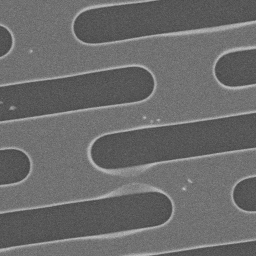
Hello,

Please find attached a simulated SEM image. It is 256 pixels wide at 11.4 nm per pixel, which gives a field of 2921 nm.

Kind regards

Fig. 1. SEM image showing groups of lines, slits or small figures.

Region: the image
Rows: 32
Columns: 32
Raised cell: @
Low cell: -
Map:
@@@@@@@@@@@@@@@@----------------
@@@@@@@@@@----------------------
@@@@@@@@@-----------------------
-@@@@@@@@-------------------@@@@
-@@@@@@@@@--------@@@@@@@@@@@@@@
--@@@@@@@@@@@@@@@@@@@@@@@@@@@@@@
-@@@@@@@@@@@@@@@@@@@@@@@@@@@@---
@@@@@@@@@@@@@@@@@@@@@@@@@@@-----
@@@@@@@@@@@@@@@---@@@@@@@@@-----
@@@@@@@@@----------@@@@@@@@-----
@@-----------------@@@@@@@@@----
-------------------@@@@@@@@@@@@@
------------------@@@@@@@@@@@@@@
------------@@@@@@@@@@@@@@@@@@@@
-----@@@@@@@@@@@@@@@@@@@@@@@@---
@@@@@@@@@@@@@@@@@@@@@@----------
@@@@@@@@@@@@@@@@----------------
@@@@@@@@@@@@--------------------
@@@@@@@@@@@---------------------
---@@@@@@@@--------------@@@@@@@
----@@@@@@@@-------@@@@@@@@@@@@@
----@@@@@@@@@@@@@@@@@@@@@@@@@@@@
---@@@@@@@@@@@@@@@@@@@@@@@@@@@--
@@@@@@@@@@@@@@@@@@@@@@@@@@@@@---
@@@@@@@@@@@@@--------@@@@@@@@---
@@@@@@@@--------------@@@@@@@---
@@--------------------@@@@@@@@@-
---------------------@@@@@@@@@@@
------------------@@@@@@@@@@@@@@
-------------@@@@@@@@@@@@@@@@@@@
----@@@@@@@@@@@@@@@@@@@@@@@@----
@@@@@@@@@@@@@@@@@@@@@@----------